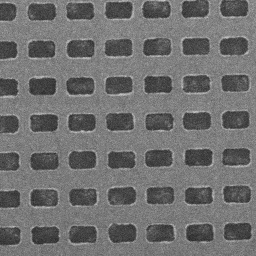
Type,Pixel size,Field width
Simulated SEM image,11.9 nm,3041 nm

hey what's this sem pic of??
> a regular array of holes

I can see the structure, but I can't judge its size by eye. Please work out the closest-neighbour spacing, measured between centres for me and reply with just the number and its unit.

0.437 µm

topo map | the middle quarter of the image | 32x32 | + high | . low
++++++++++++++++++++++++++++++++
++++++++++++++++++++++++++++++++
++++++++++++++++++++++++++++++++
+......++++......+++.......+++..
+.......++.......+++.......++...
+.......++.......+++.......++...
+.......++.......+++.......+++..
+......++++.....+++++.+++++++++.
++++++++++++++++++++++++++++++++
++++++++++++++++++++++++++++++++
++++++++++++++++++++++++++++++++
++++++++++++++++++++++++++++++++
++.....++++......++++......+++..
+.......++........++.......++...
+.......++........++.......+++..
+.......+++.......++.......+++..
+......++++......++++......++++.
++++++++++++++++++++++++++++++++
++++++++++++++++++++++++++++++++
++++++++++++++++++++++++++++++++
++++++++++++++++++++++++++++++++
+++++++++++++++++++++......++++.
+.......+++.......++.......+++..
+.......+++.......++.......+++..
+.......+++.......++.......+++..
+.......+++.......+++......++++.
++...+++++++++++++++++++++++++++
++++++++++++++++++++++++++++++++
++++++++++++++++++++++++++++++++
++++++++++++++++++++++++++++++++
++++++++++++++++.+++++++++++++++
++......+++.......+++......+++..